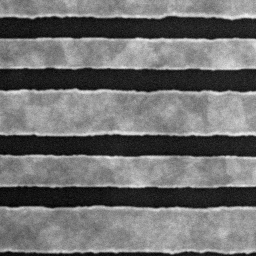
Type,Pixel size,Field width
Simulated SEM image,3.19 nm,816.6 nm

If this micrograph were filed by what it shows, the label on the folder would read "lines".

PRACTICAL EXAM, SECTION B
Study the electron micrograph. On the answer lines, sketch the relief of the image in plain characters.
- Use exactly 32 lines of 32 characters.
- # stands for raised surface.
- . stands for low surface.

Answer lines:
################################
################################
................................
................................
................................
################################
################################
################################
################################
................................
................................
##################.########.##.#
################################
################################
################################
################################
################################
................................
................................
##.####..##.....................
################################
################################
################################
................................
................................
................................
################################
################################
################################
################################
################################
....#########.#.....###..#.#####